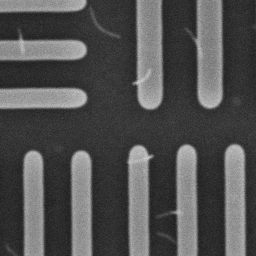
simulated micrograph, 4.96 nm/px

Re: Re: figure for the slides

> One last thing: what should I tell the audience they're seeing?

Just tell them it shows groups of lines, slits or small figures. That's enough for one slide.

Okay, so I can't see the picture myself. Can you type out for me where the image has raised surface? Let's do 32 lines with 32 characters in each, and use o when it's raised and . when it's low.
ooooooooooo......ooo.....ooo....
.................ooo.....ooo....
.................ooo.....ooo....
.................ooo.....ooo....
.................ooo.....ooo....
oooooooooo.......ooo.....ooo....
ooooooooooo......ooo.....ooo....
.................ooo.....ooo....
.................ooo.....ooo....
.................ooo.....ooo....
.................ooo.....ooo....
oooooooooo.......ooo.....ooo....
ooooooooooo......ooo.....ooo....
..................o.............
................................
................................
................................
................................
.................o.....o.....o..
...oo....oo.....ooo...oo....oo..
...oo....oo.....oo....oo....oo..
...oo....oo.....oo....oo....ooo.
...oo....oo.....oo....oo....ooo.
...oo....oo.....oo....oo....ooo.
...oo....oo.....oo....oo....ooo.
...oo....oo.....oo....oo....ooo.
...oo....oo.....oo....ooo...ooo.
...oo....oo.....oo....ooo...ooo.
...oo....oo.....oo....ooo...ooo.
...oo....oo.....oo....ooo...ooo.
...oo....oo.....oo....ooo...ooo.
...oo....oo.....oo....ooo...ooo.